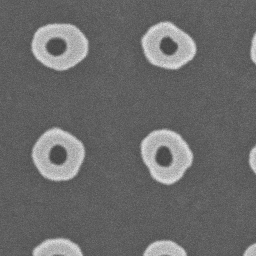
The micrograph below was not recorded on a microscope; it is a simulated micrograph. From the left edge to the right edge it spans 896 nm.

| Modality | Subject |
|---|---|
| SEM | ring-shaped raised bodies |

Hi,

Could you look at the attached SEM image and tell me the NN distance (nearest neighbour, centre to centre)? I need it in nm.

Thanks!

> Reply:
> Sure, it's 379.